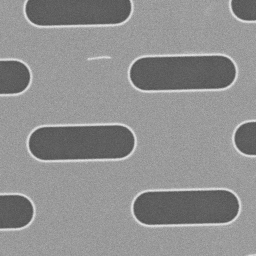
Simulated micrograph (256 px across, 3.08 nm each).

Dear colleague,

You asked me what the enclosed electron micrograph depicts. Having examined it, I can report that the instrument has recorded groups of lines, slits or small figures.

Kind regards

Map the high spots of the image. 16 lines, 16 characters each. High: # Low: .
##......######..
##.....#########
################
##########....##
..######.......#
..#######.....##
################
################
##......#######.
##......#######.
################
################
..######.......#
..######.......#
################
################